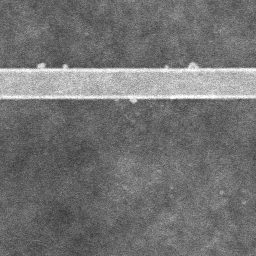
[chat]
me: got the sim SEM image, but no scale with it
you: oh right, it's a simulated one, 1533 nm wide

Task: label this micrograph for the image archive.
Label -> one or a few lines or trenches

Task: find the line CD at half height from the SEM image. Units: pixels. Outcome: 26.8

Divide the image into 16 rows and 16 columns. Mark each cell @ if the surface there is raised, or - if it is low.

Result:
----------------
----------------
----------------
----------------
@@@@@@@@@@@@@@@@
@@@@@@@@@@@@@@@@
----------------
----------------
----------------
----------------
----------------
----------------
----------------
----------------
----------------
----------------